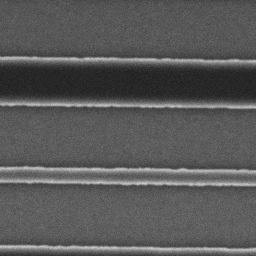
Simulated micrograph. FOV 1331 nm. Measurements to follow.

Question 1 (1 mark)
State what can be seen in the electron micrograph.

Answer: lines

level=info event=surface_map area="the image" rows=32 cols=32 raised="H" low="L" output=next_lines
LLLLLLLLLLLLLLLLLLLLLLLLLLLLLLLL
LLLLLLLLLLLLLLLLLLLLLLLLLLLLLLLL
LLLLLLLLLLLLLLLLLLLLLLLLLLLLLLLL
LLLLLLLLLLLLLLLLLLLLLLLLLLLLLLLL
LLLLLLLLLLLLLLLLLLLLLLLLLLLLLLLL
LLLLLLLLLLLLLLLLLLLLLLLLLLLLLLLL
LLLLLLLLLLLLLLLLLLLLLLLLLLLLLLLL
HHHHHHHHHHHHHHHHHHHHHHHHHHLLLHLL
HHHHHHHHHHHHHHHHHHHHHHHHHHHHHHHH
HHHHHHHHHHHHHHHHHHHHHHHHHHHHHHHH
HHHHHHHHHHHHHHHHHHHHHHHHHHHHHHHH
HHHHHHHHHHHHHHHHHHHHHHHHHHHHHHHH
HHHHHHHHHHHHHHHHHHHHHHHHHHHHHHHH
LLLLLLLLLLLLLLLLLLLLLLLLLLLLLLLL
LLLLLLLLLLLLLLLLLLLLLLLLLLLLLLLL
LLLLLLLLLLLLLLLLLLLLLLLLLLLLLLLL
LLLLLLLLLLLLLLLLLLLLLLLLLLLLLLLL
LLLLLLLLLLLLLLLLLLLLLLLLLLLLLLLL
LLLLLLLLLLLLLLLLLLLLLLLLLLLLLLLL
LLLLLLLLLLLLLLLLLLLLLLLLLLLLLLLL
LLLLLLLLLLLLLLLLLLLLLLLLLLLLLLLL
HHHHHHHHHHHHHHHHHHHHHHHHHHHHHHHH
HHHHHHHHHHHHHHHHHHHHHHHHHHHHHHHH
LLLLLLLLLLLLLLLLLLLLLLLLLLLLLLLL
LLLLLLLLLLLLLLLLLLLLLLLLLLLLLLLL
LLLLLLLLLLLLLLLLLLLLLLLLLLLLLLLL
LLLLLLLLLLLLLLLLLLLLLLLLLLLLLLLL
LLLLLLLLLLLLLLLLLLLLLLLLLLLLLLLL
LLLLLLLLLLLLLLLLLLLLLLLLLLLLLLLL
LLLLLLLLLLLLLLLLLLLLLLLLLLLLLLLL
LLLLLLLLLLLLLLLLLLLLLLLLLLLLLLLL
HHHHHHHHHHHHHHHHHHHHHHHHHHHHHHHH